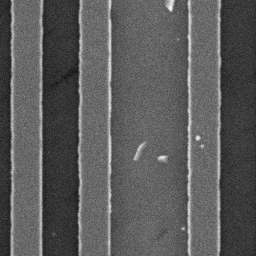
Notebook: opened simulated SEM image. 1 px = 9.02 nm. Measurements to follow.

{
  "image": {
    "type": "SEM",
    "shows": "lines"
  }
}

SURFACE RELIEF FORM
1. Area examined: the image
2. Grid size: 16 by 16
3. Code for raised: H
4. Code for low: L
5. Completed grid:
LHHLLHHLLLLLHHLL
LHHLLHHLLLLLHHLL
LHHLLHHLLLLLHHLL
LHHLLHHLLLLLHHLL
LHHLLHHLLLLLHHLL
LHHLLHHLLLLLHHLL
LHHLLHHLLLLLHHLL
LHHLLHHLLLLLHHLL
LHHLLHHLLLLLHHLL
LHHLLHHLLLLLHHLL
LHHLLHHLLLLLHHLL
LHHLLHHLLLLLHHLL
LHHLLHHLLLLLHHLL
LHHLLHHLLLLLHHLL
LHHLLHHLLLLLHHLL
LHHLLHHLLLLLHHLL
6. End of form